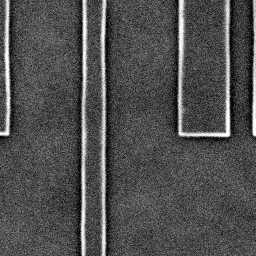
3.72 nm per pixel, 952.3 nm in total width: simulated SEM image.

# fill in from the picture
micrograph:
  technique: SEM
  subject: wiring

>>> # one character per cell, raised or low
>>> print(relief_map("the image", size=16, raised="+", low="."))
+....++....+++..
+....++....+++..
.....++....+++..
+....++....+++..
+....++....+++..
+....++....+++..
+....++....+++..
+....++....+++..
.....++.........
.....++.........
.....++.........
.....++.........
.....++.........
.....++.........
.....++.........
.....++.........